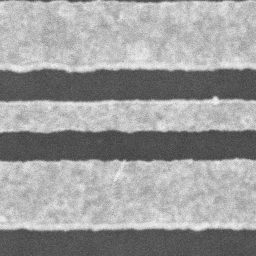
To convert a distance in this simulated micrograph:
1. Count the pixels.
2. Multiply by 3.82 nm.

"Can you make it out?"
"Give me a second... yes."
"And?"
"lines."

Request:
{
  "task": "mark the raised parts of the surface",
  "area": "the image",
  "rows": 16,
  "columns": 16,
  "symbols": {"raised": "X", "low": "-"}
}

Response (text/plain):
XXXXXXXXXXXXXXXX
XXXXXXXXXXXXXXXX
XXXXXXXXXXXXXXXX
XXXXXXXXXXXXXXXX
----------------
----------------
XXXXXXXXXXXXXXXX
XXXXXXXXXXXXXXXX
----------------
----------------
XXXXXXXXXXXXXXXX
XXXXXXXXXXXXXXXX
XXXXXXXXXXXXXXXX
XXXXXXXXXXXXXXXX
----------------
----------------